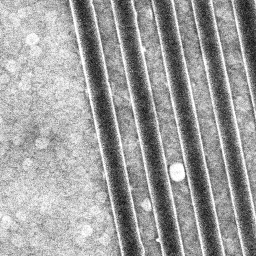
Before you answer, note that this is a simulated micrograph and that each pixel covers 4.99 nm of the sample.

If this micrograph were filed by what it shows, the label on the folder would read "parallel lines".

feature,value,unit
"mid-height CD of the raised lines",105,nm